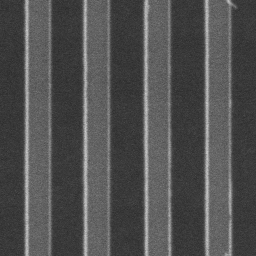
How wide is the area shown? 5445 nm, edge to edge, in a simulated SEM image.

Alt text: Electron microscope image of lines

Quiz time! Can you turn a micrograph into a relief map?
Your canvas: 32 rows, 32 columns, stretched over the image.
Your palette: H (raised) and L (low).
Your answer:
HHHLLLHHHHHLLLHHHHLLLHHHHHLLLHHH
HHHLLLHHHHHLLLHHHHLLLHHHHHLLLHHH
HHHLLLHHHHHLLLHHHHLLLHHHHHLLLHHH
HHHLLLHHHHHLLLHHHHLLLHHHHHLLLHHH
HHHLLLHHHHHLLLHHHHLLLHHHHHLLLHHH
HHHLLLHHHHHLLLHHHHLLLHHHHHLLLHHH
HHHLLLHHHHHLLLHHHHLLLHHHHHLLLHHH
HHHLLLHHHHHLLLHHHHLLLHHHHHLLLHHH
HHHLLLHHHHHLLLHHHHLLLHHHHHLLLHHH
HHHLLLHHHHHLLLHHHHLLLHHHHHLLLHHH
HHHLLLHHHHHLLLHHHHLLLHHHHHLLLHHH
HHHLLLHHHHHLLLHHHHLLLHHHHHLLLHHH
HHHLLLHHHHHLLLHHHHLLLHHHHHLLLHHH
HHHLLLHHHHHLLLHHHHLLLHHHHHLLLHHH
HHHLLLHHHHHLLLHHHHLLLHHHHHLLLHHH
HHHLLLHHHHHLLLHHHHLLLHHHHHLLLHHH
HHHLLLHHHHHLLLHHHHLLLHHHHHLLLHHH
HHHLLLHHHHHLLLHHHHLLLHHHHHLLLHHH
HHHLLLHHHHHLLLHHHHLLLHHHHHLLLHHH
HHHLLLHHHHHLLLHHHHLLLHHHHHLLLHHH
HHHLLLHHHHHLLLHHHHLLLHHHHHLLLHHH
HHHLLLHHHHHLLLHHHHLLLHHHHHLLLHHH
HHHLLLHHHHHLLLHHHHLLLHHHHHLLLHHH
HHHLLLHHHHHLLLHHHHLLLHHHHHLLLHHH
HHHLLLHHHHHLLLHHHHLLLHHHHHLLLHHH
HHHLLLHHHHHLLLHHHHLLLHHHHHLLLHHH
HHHLLLHHHHHLLLHHHHLLLHHHHHLLLHHH
HHHLLLHHHHHLLLHHHHLLLHHHHHLLLHHH
HHHLLLHHHHHLLLHHHHLLLHHHHHLLLHHH
HHHLLLHHHHHLLLHHHHLLLHHHHHLLLHHH
HHHLLLHHHHHLLLHHHHLLLHHHHHLLLHHH
HHHLLLHHHHHLLLHHHHLLLHHHHHLLLHHH